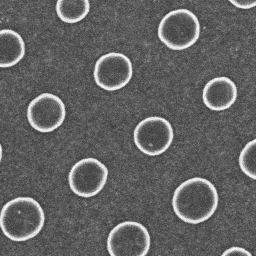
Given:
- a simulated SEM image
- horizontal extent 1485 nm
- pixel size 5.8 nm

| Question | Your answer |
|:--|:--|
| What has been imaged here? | a regular array of raised bodies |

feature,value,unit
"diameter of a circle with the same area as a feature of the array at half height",207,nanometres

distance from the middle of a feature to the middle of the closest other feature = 0.444 µm